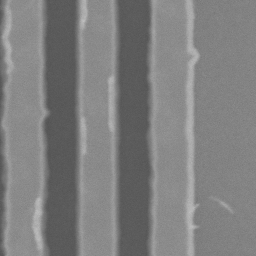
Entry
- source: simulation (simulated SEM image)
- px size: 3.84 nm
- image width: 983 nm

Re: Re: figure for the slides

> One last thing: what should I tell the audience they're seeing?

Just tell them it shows one or a few lines or trenches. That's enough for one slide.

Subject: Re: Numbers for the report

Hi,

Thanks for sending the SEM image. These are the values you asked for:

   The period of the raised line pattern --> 283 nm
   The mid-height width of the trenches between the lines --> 128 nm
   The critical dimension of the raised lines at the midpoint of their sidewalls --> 0.153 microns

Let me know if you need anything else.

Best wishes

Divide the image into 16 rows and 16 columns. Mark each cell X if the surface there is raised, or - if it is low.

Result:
XXX--XX--XXX----
XXX--XX--XXX----
XXX--XX--XXX----
XXX--XX--XXX----
XXX--XX--XXX----
XXX--XX--XXX----
XXX--XX--XXX----
XXX--XX--XXX----
XXX--XX--XXX----
XXX--XX--XXX----
XXX--XX--XXX----
XXX--XX--XXX----
XXX--XX--XXX----
XXX--XX--XXX----
XXX--XX--XXX----
XXX--XX--XXX----